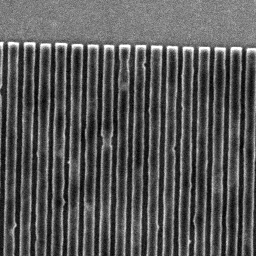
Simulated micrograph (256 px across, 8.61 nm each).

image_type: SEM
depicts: parallel lines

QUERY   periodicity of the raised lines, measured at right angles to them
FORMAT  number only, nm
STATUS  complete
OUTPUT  137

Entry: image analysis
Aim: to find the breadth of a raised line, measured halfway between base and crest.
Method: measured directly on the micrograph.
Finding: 0.0903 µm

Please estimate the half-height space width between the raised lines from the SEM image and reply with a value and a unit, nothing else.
5.75 pixels